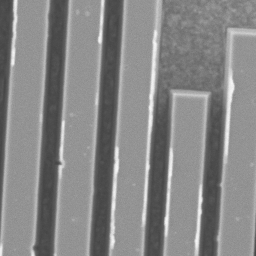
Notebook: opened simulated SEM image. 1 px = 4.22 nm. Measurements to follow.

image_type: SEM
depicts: parallel lines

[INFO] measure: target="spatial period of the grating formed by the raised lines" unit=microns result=0.23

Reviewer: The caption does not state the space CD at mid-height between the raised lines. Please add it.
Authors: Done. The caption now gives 71.6 nm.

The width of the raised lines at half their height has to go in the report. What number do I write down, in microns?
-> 0.159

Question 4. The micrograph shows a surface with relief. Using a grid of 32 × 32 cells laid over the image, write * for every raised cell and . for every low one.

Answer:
..****..*****..*****............
..****..*****..*****............
..****..*****..*****............
.*****..*****..*****............
.*****..*****..*****.........***
.*****..*****..*****.........***
.*****..*****..*****.........***
.*****..*****..*****.........***
.*****..*****..****.........****
.*****..*****..****.........****
.*****..*****..****.........****
.*****..*****..****...*.....****
.*****..****...****..*****..****
.*****..****...****..*****..****
.*****..****...****..*****..****
.****...****..*****..*****..****
.****..*****..*****..*****..****
.****..*****..*****..*****..****
.****..*****..*****..*****..****
*****..*****..*****..*****..****
*****..*****..*****..*****..****
*****..*****..*****..*****..****
*****..*****..*****..****...****
*****..*****..*****..****..*****
*****..*****..*****..****...****
*****..*****..*****..****..*****
*****..*****..****...****..*****
*****..*****..****...****..*****
*****..*****..****..*****..*****
*****..****...****..*****..*****
****...****...****..*****..*****
****...****...****..*****..*****